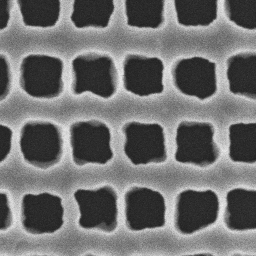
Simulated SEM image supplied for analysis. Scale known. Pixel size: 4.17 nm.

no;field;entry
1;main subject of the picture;a regular array of holes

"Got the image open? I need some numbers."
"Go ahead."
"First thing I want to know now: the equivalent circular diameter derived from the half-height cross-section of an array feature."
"180 nm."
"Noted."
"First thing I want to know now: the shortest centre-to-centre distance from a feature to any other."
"210 nanometers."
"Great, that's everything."